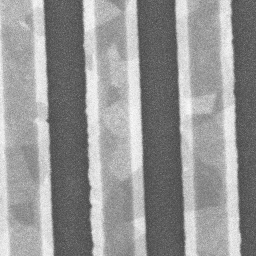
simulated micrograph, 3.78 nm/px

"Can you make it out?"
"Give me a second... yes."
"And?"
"one or a few lines or trenches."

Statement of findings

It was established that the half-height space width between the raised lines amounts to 0.19 micrometres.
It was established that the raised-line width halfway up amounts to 0.161 microns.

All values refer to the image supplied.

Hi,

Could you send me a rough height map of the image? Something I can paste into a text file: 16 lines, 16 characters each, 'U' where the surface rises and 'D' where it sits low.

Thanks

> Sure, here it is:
UUDDDDUUDDDUUUDD
UUDDDDUUDDDUUUDD
UUDDDDUUDDDUUUDD
UUDDDDUUDDDUUUDD
UUUDDDUUDDDDUUDD
UUUDDDUUDDDDUUDD
UUUDDDUUDDDDUUDD
UUUDDDUUDDDDUUDD
UUUDDDUUDDDDUUDD
UUUDDDUUUDDDUUDD
UUUDDDUUUDDDUUDD
UUUDDDUUUDDDUUUD
UUUDDDUUUDDDUUUD
UUUDDDUUUDDDUUUD
UUUDDDUUUDDDUUUD
UUUDDDUUUDDDUUUD